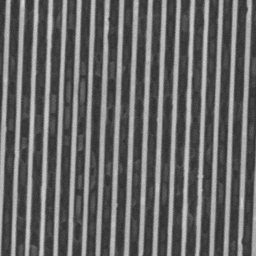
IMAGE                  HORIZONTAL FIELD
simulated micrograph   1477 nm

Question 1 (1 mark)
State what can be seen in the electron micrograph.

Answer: parallel lines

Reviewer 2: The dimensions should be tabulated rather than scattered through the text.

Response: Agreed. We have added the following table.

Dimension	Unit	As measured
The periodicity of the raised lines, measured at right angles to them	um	0.0818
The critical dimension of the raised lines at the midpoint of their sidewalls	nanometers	27.4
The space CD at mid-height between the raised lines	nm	54.8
